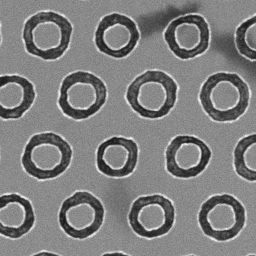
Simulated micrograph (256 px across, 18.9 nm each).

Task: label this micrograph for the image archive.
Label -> a regular array of ring-shaped grooves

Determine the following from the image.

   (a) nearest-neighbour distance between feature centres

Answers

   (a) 1290 nanometres